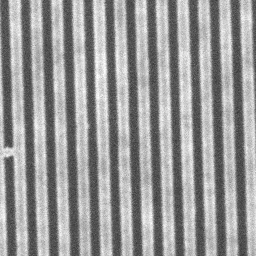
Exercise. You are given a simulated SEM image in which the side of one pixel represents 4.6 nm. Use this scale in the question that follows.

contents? parallel lines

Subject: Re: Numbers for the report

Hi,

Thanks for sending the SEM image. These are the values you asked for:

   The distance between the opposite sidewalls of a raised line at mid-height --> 46.5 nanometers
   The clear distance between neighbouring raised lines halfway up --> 50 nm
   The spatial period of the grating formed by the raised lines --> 96.4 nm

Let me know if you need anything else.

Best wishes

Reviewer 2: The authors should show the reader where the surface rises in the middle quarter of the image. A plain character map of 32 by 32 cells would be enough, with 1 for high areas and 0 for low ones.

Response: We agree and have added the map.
00011000110001110011100011000110
00011000110001110011100011000111
00011000110001110011100011000111
00011000111001110001100011000110
00011000111001110001100011000110
00011000111001110001100011000111
00011000111001110001100011000111
00011000111001110001100011000111
00011000111001110001100011000111
00011000111001110001100011000111
00011000111001110001100011000111
00011000111000110001100011100111
00011100111000110001100011100111
00011100111000110001100011100111
00011100111000110001100011100111
00011100111000110001100011100111
00011100111000110001100011100111
00011100111000110001100011100111
00011100111000110001100011100011
00011100111000110001100011100011
00011100011000110001100011100011
10011100011000110001100011100011
10001100011000110001100011100011
10011100011000110001100011100011
10001100011000110001100011100011
10001100011000110001110011100011
10001100011000110001110011100011
10001100011000110001110001100011
10001100011000111001110001100011
10001100011000111001110001100011
10001100011000111001110001100011
10001100011000111001110001100011